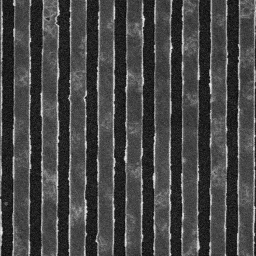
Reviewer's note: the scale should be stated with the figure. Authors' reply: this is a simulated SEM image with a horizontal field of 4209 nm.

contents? parallel lines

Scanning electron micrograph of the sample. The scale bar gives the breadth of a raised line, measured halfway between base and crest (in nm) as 269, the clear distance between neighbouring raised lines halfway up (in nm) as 187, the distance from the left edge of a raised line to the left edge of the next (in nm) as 461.